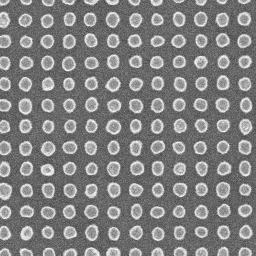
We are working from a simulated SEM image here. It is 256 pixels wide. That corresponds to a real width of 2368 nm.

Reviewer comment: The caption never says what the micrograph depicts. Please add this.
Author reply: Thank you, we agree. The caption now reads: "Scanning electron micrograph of a regular array of raised bodies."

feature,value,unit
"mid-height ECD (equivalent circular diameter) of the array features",118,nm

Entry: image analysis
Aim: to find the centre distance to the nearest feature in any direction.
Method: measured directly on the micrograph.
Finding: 193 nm